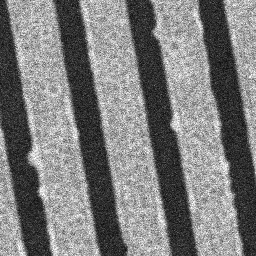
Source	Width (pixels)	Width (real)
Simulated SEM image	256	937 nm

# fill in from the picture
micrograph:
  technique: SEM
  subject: one or a few lines or trenches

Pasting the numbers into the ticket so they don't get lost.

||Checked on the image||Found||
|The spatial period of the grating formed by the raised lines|262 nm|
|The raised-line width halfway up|158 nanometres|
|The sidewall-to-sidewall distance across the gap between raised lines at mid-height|102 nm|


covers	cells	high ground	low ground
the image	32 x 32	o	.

.oooooo...oooooo...oooooo...oooo
.oooooo...oooooo....ooooo...oooo
.oooooo....ooooo....ooooo...oooo
..ooooo....ooooo....ooooo....ooo
..ooooo....ooooo....ooooo....ooo
..ooooo....ooooo....ooooo....ooo
..oooooo...oooooo...oooooo...ooo
..oooooo...oooooo...oooooo....oo
...ooooo...oooooo....ooooo....oo
...ooooo....ooooo....ooooo....oo
...ooooo....ooooo....ooooo....oo
...oooooo...oooooo...ooooo....oo
...oooooo...oooooo...oooooo...oo
....ooooo....ooooo....ooooo....o
....ooooo....ooooo....ooooo....o
....ooooo....ooooo...ooooooo...o
....oooooo...ooooo....ooooo....o
....oooooo...oooooo...ooooo....o
o...oooooo...oooooo....ooooo...o
o...oooooo....ooooo....ooooo....
o...oooooo....ooooo....oooooo...
o....ooooo....ooooo....oooooo...
o....oooooo...oooooo...oooooo...
o....oooooo...oooooo...oooooo...
oo...oooooo....ooooo....ooooo...
oo....ooooo....ooooo....ooooo...
oo....ooooo....ooooo....ooooo...
oo....oooooo...oooooo...oooooo..
oo....oooooo...oooooo...oooooo..
oo....oooooo...oooooo...oooooo..
ooo...oooooo....ooooo....ooooo..
ooo....ooooo....ooooo....ooooo..